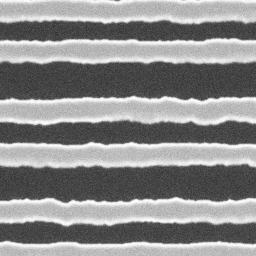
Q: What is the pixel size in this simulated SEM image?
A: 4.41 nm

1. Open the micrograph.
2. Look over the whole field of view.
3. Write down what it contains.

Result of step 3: lines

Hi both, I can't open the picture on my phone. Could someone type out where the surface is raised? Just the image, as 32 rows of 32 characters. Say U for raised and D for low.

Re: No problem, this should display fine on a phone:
UUUUUUUUUUUUUUUUUUUUUUUUUUUUUUUU
UUUUUUUUUUUUUUUUUUUUUUUUUUUUUUUU
UUUUUUUDUUUUUUUUUUUUDUUUUUUUDDUU
DDDDDDDDDDDDDDDDDDDDDDDDDDDDDDDD
DDDDDDDDDDDDDDDDDDDDDDDDDDDDDDDD
UUUUUUUUUUUUUUUUUUUUUUUUUUUUUUUU
UUUUUUUUUUUUUUUUUUUUUUUUUUUUUUUU
UUUUUUUUUUUUUUUUUUUUUUUUUUUUUUUU
DDDDDDDDDDDDDDDDDDDDDDDDDDDDDDDD
DDDDDDDDDDDDDDDDDDDDDDDDDDDDDDDD
DDDDDDDDDDDDDDDDDDDDDDDDDDDDDDDD
DDDDDDDDDDDDDDDDDDDDDDDDDDDDDDDD
DUDDDDDUUUUUUUUUUUUUUUUUUDUUUUUU
UUUUUUUUUUUUUUUUUUUUUUUUUUUUUUUU
UUUUUUUUUUUUUUUUUUUUUUUUUUUUUUUU
DDDDUUDDDDDDDDDDDDDDDDDDDUDDDDDD
DDDDDDDDDDDDDDDDDDDDDDDDDDDDDDDD
DDDDDDDDDDDDDDDDDDDDDDDDDDDDDDDD
UUUUUUUUUUUUUUUUUUUUUUUUUUUUUUUU
UUUUUUUUUUUUUUUUUUUUUUUUUUUUUUUU
UUUUUUUUUUUUUUUUUUUUUUUUUUUDUDDU
DDDDDDDDDDDDDDDDDDDDDDDDDDDDDDDD
DDDDDDDDDDDDDDDDDDDDDDDDDDDDDDDD
DDDDDDDDDDDDDDDDDDDDDDDDDDDDDDDD
DDDDDDDDDDDDDDDDDDDDDDDDDDDDDDDD
UUUUUUUUUUUUUUUUUUUUUUUUUUUUUUUU
UUUUUUUUUUUUUUUUUUUUUUUUUUUUUUUU
UUUUUUUUUUUUUUUUUUUUUUUUUUUUUUUU
DDDDDDDDDDDDDDDDDDDDDDDDDDDDDDDD
DDDDDDDDDDDDDDDDDDDDDDDDDDDDDDDD
UUUDDDUUUUDDUDDUUUUUUDUUUUUUUUUD
UUUUUUUUUUUUUUUUUUUUUUUUUUUUUUUU